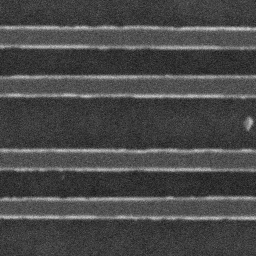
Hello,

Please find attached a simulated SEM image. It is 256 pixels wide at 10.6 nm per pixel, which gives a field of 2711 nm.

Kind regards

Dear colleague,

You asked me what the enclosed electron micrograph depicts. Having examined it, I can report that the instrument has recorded lines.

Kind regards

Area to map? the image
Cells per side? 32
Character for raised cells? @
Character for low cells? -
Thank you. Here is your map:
--------------------------------
--------------------------------
--------------------------------
@@@@@@@@@@@@@@@@@@@@@@@@@@@@@@@@
@@@@@@@@@@@@@@@@@@@@@@@@@@@@@@@@
@@@@@@@@@@@@@@@@@@@@@@@@@@@@@@@@
--------------------------------
--------------------------------
--------------------------------
--------------------------------
@@@@@@@@@@@@@@@@@@@@@@@@@@@@@@@@
@@@@@@@@@@@@@@@@@@@@@@@@@@@@@@@@
--------------------------------
--------------------------------
--------------------------------
--------------------------------
--------------------------------
--------------------------------
--------------------------------
@@@@@@@@@@@@@@@@@@@@@@@@@@@@@@@@
@@@@@@@@@@@@@@@@@@@@@@@@@@@@@@@@
--------------------------------
--------------------------------
--------------------------------
--------------------------------
@@@@@@@@@@@@@@@@@@@@@@@@@@@@@@@@
@@@@@@@@@@@@@@@@@@@@@@@@@@@@@@@@
--------------------------------
--------------------------------
--------------------------------
--------------------------------
--------------------------------